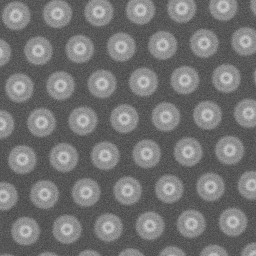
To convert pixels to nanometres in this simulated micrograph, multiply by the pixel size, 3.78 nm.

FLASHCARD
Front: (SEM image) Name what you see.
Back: an array of small figures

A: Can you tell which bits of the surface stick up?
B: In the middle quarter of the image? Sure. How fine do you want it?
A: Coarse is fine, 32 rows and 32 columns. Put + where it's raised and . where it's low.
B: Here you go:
................................
..................++++......++++
+......+++++.....++++++....+++++
++....+++++++...+++++++....+++++
++....+++++++...+++++++....+++++
+++...+++++++...+++++++....+++++
++....+++++++....++++++.....++++
++.....+++++......++++..........
+...............................
................................
..............++.......+++++....
...++++.....++++++....++++++....
..++++++....++++++....+++++++...
.+++++++....+++++++...+++++++...
.+++++++....+++++++...+++++++...
.+++++++....++++++.....+++++....
..+++++......++++.......+++.....
....++..........................
................................
..........+........+++.......+++
++......+++++.....++++++....++++
+++....++++++....+++++++....++++
+++....+++++++...+++++++....++++
+++....+++++++...+++++++....++++
+++....++++++.....+++++......+++
+++.....+++++......+++..........
++..............................
................................
...............++.......++++....
...+++++.....++++++....++++++...
..+++++++....++++++....+++++++..
..+++++++....++++++....+++++++..